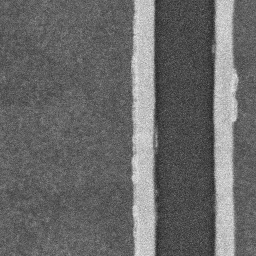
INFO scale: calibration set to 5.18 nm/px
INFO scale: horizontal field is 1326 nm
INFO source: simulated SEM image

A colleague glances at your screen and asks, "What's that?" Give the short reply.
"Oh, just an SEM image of one or a few lines or trenches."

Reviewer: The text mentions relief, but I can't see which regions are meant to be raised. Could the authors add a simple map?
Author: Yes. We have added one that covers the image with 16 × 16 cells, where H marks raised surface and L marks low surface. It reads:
HHHHHHHHHLLLLLHH
HHHHHHHHHLLLLLHH
HHHHHHHHHLLLLLHH
HHHHHHHHHLLLLLHH
HHHHHHHHHLLLLLHH
HHHHHHHHHLLLLLHH
HHHHHHHHHLLLLLHH
HHHHHHHHHLLLLLHH
HHHHHHHHHLLLLLHH
HHHHHHHHHLLLLLHH
HHHHHHHHHLLLLLHH
HHHHHHHHHLLLLLHH
HHHHHHHHHLLLLLHH
HHHHHHHHHLLLLLHH
HHHHHHHHHLLLLLHH
HHHHHHHHHLLLLLHH